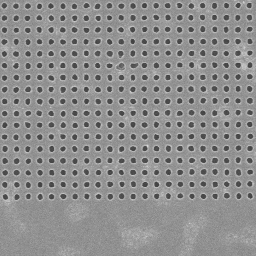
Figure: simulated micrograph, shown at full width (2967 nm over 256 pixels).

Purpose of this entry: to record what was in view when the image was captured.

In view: a regular array of holes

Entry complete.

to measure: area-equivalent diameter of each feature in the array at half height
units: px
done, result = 5.64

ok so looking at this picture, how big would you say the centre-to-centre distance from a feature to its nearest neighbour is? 132 nanometers